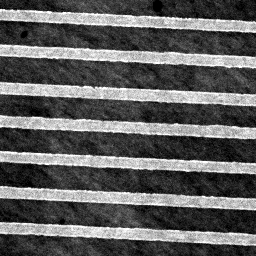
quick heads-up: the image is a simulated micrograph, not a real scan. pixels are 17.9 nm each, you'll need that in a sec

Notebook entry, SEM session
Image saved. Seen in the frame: parallel lines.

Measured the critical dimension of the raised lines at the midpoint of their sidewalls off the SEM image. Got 183 nm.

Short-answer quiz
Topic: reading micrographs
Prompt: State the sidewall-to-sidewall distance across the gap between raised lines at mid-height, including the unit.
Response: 25 pixels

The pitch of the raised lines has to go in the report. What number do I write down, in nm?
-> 635